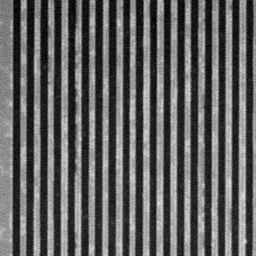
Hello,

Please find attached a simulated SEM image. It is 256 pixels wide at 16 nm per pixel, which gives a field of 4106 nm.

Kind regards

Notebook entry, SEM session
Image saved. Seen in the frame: parallel lines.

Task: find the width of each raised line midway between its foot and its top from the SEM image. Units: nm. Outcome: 78.2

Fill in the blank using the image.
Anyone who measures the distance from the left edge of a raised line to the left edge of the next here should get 220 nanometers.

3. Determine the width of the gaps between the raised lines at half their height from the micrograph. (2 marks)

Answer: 140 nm